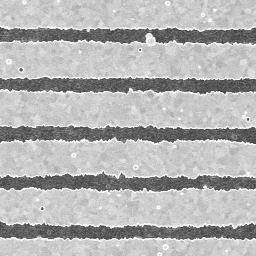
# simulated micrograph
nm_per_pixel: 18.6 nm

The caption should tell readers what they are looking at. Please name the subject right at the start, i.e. parallel lines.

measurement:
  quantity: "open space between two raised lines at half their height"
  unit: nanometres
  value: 221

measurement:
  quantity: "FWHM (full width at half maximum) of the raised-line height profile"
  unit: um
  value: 0.664